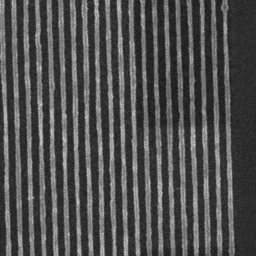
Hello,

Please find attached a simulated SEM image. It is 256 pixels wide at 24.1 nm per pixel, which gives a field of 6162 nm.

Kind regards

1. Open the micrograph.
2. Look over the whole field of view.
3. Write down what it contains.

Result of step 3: parallel lines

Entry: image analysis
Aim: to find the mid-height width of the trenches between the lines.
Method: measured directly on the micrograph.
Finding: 0.186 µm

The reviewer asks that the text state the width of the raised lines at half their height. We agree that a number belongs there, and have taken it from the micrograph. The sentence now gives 0.0963 micrometres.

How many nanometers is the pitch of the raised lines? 282